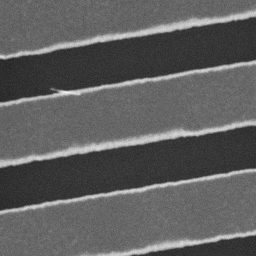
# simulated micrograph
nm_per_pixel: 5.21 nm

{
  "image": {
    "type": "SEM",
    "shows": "lines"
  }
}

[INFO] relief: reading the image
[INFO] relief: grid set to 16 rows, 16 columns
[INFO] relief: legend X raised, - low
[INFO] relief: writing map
XXXXXXXXXXXXXXXX
XXXXXXXXXXXXX---
XXXXXXX---------
X---------------
-----------XXXXX
-----XXXXXXXXXXX
XXXXXXXXXXXXXXXX
XXXXXXXXXXXXXXXX
XXXXXXXXXXXX----
XXXXX-----------
----------------
----------XXXXXX
----XXXXXXXXXXXX
XXXXXXXXXXXXXXXX
XXXXXXXXXXXXXXXX
XXXXXXXXXXX-----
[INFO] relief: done